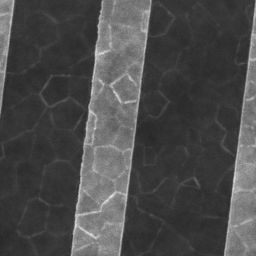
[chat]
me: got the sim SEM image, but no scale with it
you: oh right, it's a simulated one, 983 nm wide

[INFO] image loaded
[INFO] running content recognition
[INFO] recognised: one or a few lines or trenches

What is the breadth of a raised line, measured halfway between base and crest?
182 nm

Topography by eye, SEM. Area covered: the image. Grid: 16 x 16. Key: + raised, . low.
+.....+++.......
+.....+++.......
+.....+++.......
......+++.......
......+++......+
...+..+++......+
......+++......+
......+++......+
.....+++.......+
.....+++.......+
.....+++.......+
...+.+++.......+
.....+++......++
.....+++......++
.....+++......++
.....+++......++